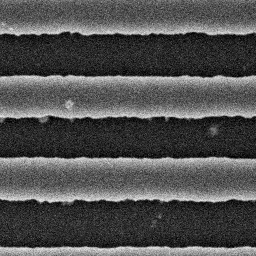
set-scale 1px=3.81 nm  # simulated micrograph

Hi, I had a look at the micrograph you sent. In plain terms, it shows lines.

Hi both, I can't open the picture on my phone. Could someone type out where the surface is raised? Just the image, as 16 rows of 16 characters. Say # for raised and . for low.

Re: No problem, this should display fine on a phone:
################
################
................
................
................
################
################
................
................
................
################
################
.#######..####.#
................
................
################